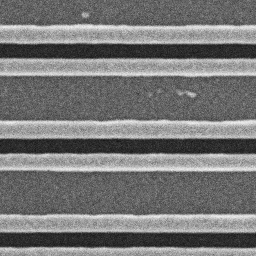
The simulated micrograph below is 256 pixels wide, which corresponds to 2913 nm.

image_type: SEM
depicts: lines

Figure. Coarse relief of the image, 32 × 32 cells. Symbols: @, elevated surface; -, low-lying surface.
--------------------------------
--------------------------------
--------------------------------
@@@@@@@@@@@@@@@@@@@@@@@@@@@@@@@@
@@@@@@@@@@@@@@@@@@@@@@@@@@@@@@@@
--------------------------------
--------------------------------
@@@@@@@@@@@@@@@@@@@@@@@@@@@@@@@@
@@@@@@@@@@@@@@@@@@@@@@@@@@@@@@@@
--------------------------------
--------------------------------
--------------------------------
--------------------------------
--------------------------------
--------------------------------
@@@@@@@@@@@@@@@@@@@@@@@@@@@@@@@@
@@@@@@@@@@@@@@@@@@@@@@@@@@@@@@@@
--------------------------------
--------------------------------
@@@@@@@@@@@@@@@@@@@@@@@@@@@@@@@@
@@@@@@@@@@@@@@@@@@@@@@@@@@@@@@@@
--------------------------------
--------------------------------
--------------------------------
--------------------------------
--------------------------------
--------------------------------
@@@@@@@@@@@@@@@@@@@@@@@@@@@@@@@@
@@@@@@@@@@@@@@@@@@@@@@@@@@@@@@@@
--------------------------------
--------------------------------
@@@@@@@@@@@@@@@@@@@@@@@@@@@@@@@@